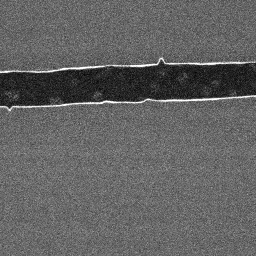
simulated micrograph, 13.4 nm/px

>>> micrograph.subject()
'one or a few lines or trenches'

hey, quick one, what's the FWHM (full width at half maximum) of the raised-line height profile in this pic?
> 489 nanometers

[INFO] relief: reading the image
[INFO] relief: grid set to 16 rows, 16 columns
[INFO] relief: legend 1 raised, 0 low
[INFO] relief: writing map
0000000000000000
0000000000000000
0000000000000000
0000000000000000
1111111111111111
1111111111111111
1111100000000000
0000000000000000
0000000000000000
0000000000000000
0000000000000000
0000000000000000
0000000000000000
0000000000000000
0000000000000000
0000000000000000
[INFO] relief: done